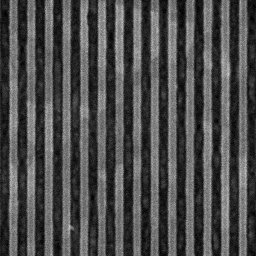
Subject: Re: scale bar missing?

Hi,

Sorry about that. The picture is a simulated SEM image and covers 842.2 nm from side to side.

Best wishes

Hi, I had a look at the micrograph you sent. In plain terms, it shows parallel lines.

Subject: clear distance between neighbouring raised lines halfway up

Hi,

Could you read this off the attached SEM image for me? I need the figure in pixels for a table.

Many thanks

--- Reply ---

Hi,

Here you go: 10.5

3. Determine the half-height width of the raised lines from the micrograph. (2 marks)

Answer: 23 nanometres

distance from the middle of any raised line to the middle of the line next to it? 58.1 nanometers